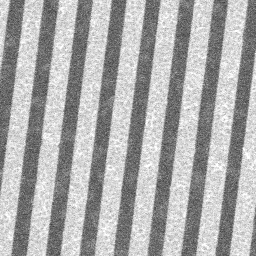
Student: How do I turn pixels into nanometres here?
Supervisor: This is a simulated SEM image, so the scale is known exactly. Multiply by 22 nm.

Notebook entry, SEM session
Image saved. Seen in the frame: parallel lines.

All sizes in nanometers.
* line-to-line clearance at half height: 338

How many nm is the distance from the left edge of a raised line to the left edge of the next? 740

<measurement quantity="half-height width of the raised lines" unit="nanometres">400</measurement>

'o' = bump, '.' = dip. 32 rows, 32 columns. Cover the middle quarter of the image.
.....ooooo....oooo....ooooo....o
o....ooooo....oooo....ooooo....o
o....oooo....ooooo....oooo....oo
o....oooo....ooooo....oooo....oo
o....oooo....ooooo....oooo....oo
o....oooo....ooooo....oooo....oo
.....oooo....oooo....ooooo....oo
....ooooo....oooo....ooooo....oo
....ooooo....oooo....ooooo....oo
.....oooo....oooo....ooooo....oo
....oooo....ooooo....ooooo...ooo
.....ooo....ooooo....oooo....ooo
....oooo....ooooo....oo.o....ooo
....oooo....ooooo....oooo....ooo
...ooooo....oooo....ooooo....ooo
...ooooo....oooo....ooooo....ooo
...ooooo....oooo....ooooo....ooo
...ooooo....oooo....ooooo....ooo
...oooo....ooooo....oooo....oooo
...ooo.....ooooo....oooo....oooo
...oooo....ooooo....oooo....oooo
...oooo....ooooo....oooo....oooo
..ooooo....oooo....ooooo....oooo
..ooooo....oooo....ooooo....oooo
..ooooo....oooo....ooooo....oooo
..ooooo....oooo....oooo.....oooo
..oooo....ooooo....oooo....ooooo
..oooo....ooooo....oooo....ooooo
..oooo....ooooo....oooo....ooooo
..oooo....ooooo....oooo....oooo.
.ooooo....oooo....ooooo....oooo.
.ooooo....oooo....ooooo....oooo.